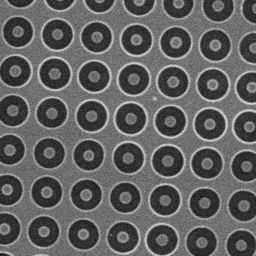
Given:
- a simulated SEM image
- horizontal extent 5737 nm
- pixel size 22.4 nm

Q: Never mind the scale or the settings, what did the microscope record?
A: an array of small figures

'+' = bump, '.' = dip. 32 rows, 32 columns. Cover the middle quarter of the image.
.++++......++++.....+++++++.++++
..++.......+++.......++++.....++
..+...+++...++.......+++.......+
..+...+++...+...+++...+....+...+
.+++.......++...+++..++...+++..+
++++.......+++.......++....+...+
+++++.....++++......++++.......+
++++++++++++++++...++++++.....++
+++++++++++++++++++++++++++.++++
+++++....+++++++++++++++++++++++
++++......++++.....++++++...++++
.++........++.......++++.....+++
.++...++...++...+....++.......++
.++...++...++...++...++...+....+
+++........++...++...++..+++...+
++++......+++.......+++...+...++
+++++....+++++......+++.......++
+++++++++++++++...++++++.....+++
++++++++++++++++++++++++++++++++
++++....+++++++.++++++++++++++++
+++.......+++......++++++...++++
+++.......+++.......+++......+++
++...++...++....+...++........++
++...++...++...++...++...++...++
+++.......++...++...++...++...++
+++......++++.......++........++
+++++...++++++.....++++......+++
++++++++++++++++++++++++.....+++
++++++++++++++++++++++++++++++++
+++.....++++++++++++++++++++++++
++.......++++.....++++++...+++++
++.......+++.......+++......++++